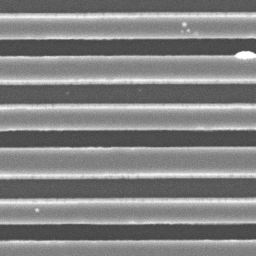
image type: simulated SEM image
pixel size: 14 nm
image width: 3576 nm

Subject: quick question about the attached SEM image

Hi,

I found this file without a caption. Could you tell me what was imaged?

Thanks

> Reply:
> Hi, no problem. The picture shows lines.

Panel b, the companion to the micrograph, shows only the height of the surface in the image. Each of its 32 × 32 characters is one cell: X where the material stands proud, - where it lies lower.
--------------------------------
--------------------------------
XXXXXXXXXXXXXXXXXXXXXXXXXXXXXXXX
XXXXXXXXXXXXXXXXXXXXXXXXXXXXXXXX
XXXXXXXXXXXXXXXXXXXXXXXXXXXXXXXX
--------------------------------
------------------------------X-
XXXXXXXXXXXXXXXXXXXXXXXXXXXXXXXX
XXXXXXXXXXXXXXXXXXXXXXXXXXXXXXXX
XXXXXXXXXXXXXXXXXXXXXXXXXXXXXXXX
--------------------------------
--------------------------------
--------------------------------
XXXXXXXXXXXXXXXXXXXXXXXXXXXXXXXX
XXXXXXXXXXXXXXXXXXXXXXXXXXXXXXXX
XXXXXXXXXXXXXXXXXXXXXXXXXXXXXXXX
--------------------------------
--------------------------------
--------------------------------
XXXXXXXXXXXXXXXXXXXXXXXXXXXXXXXX
XXXXXXXXXXXXXXXXXXXXXXXXXXXXXXXX
XXXXXXXXXXXXXXXXXXXXXXXXXXXXXXXX
--------------------------------
--------------------------------
--------------------------------
XXXXXXXXXXXXXXXXXXXXXXXXXXXXXXXX
XXXXXXXXXXXXXXXXXXXXXXXXXXXXXXXX
XXXXXXXXXXXXXXXXXXXXXXXXXXXXXXXX
--------------------------------
--------------------------------
XXXXXXXXXXXXXXXXXXXXXXXXXXXXXXXX
XXXXXXXXXXXXXXXXXXXXXXXXXXXXXXXX